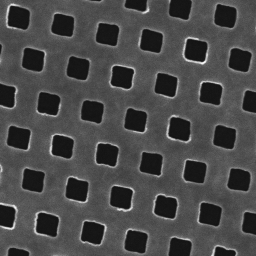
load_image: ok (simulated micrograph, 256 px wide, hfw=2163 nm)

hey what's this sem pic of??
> a regular array of holes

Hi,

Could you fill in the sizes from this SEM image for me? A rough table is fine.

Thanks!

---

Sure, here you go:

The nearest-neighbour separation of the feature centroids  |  377 nanometers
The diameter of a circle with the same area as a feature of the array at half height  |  0.199 um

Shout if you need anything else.